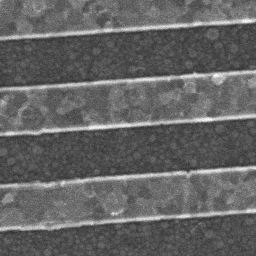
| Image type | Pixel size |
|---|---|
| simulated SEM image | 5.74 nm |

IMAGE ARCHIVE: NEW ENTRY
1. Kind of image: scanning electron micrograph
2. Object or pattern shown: one or a few lines or trenches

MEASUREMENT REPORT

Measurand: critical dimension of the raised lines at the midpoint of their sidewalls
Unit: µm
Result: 0.253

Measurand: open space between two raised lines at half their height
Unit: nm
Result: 294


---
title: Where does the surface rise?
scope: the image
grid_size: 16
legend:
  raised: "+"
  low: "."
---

++++++++++++++++
+++++++++++++...
................
................
................
..++++++++++++++
++++++++++++++++
+++++++++++++...
................
................
................
...+++++++++++++
++++++++++++++++
++++++++++++....
................
................